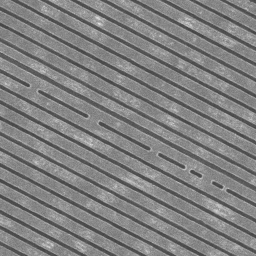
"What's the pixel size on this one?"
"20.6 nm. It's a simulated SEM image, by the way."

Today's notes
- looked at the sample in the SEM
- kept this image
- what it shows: parallel lines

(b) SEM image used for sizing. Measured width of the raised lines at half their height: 210 nm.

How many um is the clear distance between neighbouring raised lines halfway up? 0.0753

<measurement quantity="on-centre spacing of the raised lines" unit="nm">286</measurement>